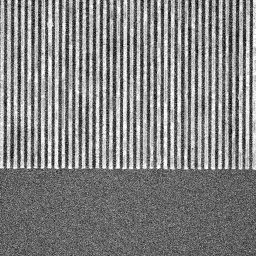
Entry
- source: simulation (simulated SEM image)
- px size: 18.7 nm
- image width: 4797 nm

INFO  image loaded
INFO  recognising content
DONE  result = parallel lines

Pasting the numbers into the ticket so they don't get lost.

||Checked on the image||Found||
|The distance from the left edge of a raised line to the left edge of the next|0.128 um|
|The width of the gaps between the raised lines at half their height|77.3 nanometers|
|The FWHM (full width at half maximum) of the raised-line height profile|51.5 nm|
